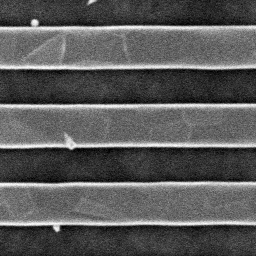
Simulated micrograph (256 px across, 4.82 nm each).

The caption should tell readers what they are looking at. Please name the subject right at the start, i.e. wiring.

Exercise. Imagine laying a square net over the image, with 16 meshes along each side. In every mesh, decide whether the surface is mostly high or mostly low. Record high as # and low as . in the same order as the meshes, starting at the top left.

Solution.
................
................
################
################
................
................
................
################
################
................
................
....############
################
################
................
................